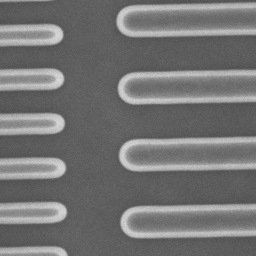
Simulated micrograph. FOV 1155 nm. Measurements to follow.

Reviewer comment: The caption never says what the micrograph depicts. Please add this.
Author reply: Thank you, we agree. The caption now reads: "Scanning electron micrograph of groups of lines, slits or small figures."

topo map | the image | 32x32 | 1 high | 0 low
00000000000000000000000000000000
00000000000000011111111111111111
00000000000000011111111111111111
11111110000000011111111111111111
11111110000000000000000000000000
00000000000000000000000000000000
00000000000000000000000000000000
00000000000000000000000000000000
00000000000000000000000000000000
11111110000000001111111111111111
11111110000000011111111111111111
00000000000000011111111111111111
00000000000000001111111111000000
00000000000000000000000000000000
00000000000000000000000000000000
11111111000000000000000000000000
11100000000000000000000000000000
00000000000000000000000000000011
00000000000000001111111111111111
00000000000000011111111111111111
11111111000000001111111111111111
11111111000000000000000000000000
00000000000000000000000000000000
00000000000000000000000000000000
00000000000000000000000000000000
00000000000000000000000000000000
11111111000000001111111111111111
11111110000000011111111111111111
00000000000000001111111111111111
00000000000000000000000000000000
00000000000000000000000000000000
11111111000000000000000000000000